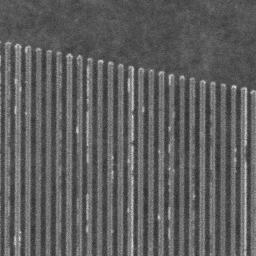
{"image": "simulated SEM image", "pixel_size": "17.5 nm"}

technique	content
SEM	parallel lines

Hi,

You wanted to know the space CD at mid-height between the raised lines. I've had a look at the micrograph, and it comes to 107 nm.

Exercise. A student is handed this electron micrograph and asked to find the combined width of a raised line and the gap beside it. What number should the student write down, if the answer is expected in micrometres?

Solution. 0.179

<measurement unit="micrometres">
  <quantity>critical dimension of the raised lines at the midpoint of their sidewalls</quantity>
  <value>0.0611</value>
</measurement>